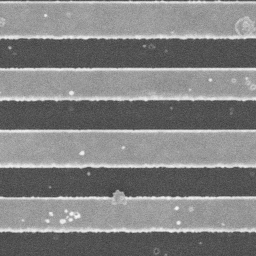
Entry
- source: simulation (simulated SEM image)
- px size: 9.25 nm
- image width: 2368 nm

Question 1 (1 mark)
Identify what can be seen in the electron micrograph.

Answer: lines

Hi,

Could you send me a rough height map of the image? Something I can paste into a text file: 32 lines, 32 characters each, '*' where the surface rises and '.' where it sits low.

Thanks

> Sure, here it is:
********************************
********************************
********************************
********************************
********************************
................................
................................
................................
................................
********************************
********************************
********************************
********.*.**..**.*.....*.....*.
................................
................................
................................
********************************
********************************
********************************
********************************
********************************
................................
................................
................................
..............**................
********************************
********************************
********************************
********************************
................................
................................
................................